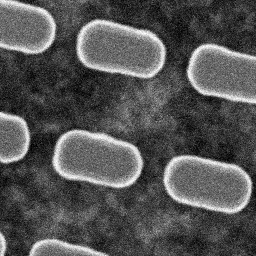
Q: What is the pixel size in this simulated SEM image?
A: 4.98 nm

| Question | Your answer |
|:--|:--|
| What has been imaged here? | raised bodies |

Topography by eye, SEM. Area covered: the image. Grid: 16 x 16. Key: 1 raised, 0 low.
1100000000000000
1110001000000000
1110011111000000
0000011111001111
0000000111001111
0000000000001111
0000000000000000
1000000000000000
1100110000000000
1101111110000000
0000111110111110
0000001100111111
0000000000011111
0000000000000000
0000000000000000
0011100000000000